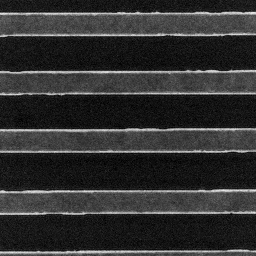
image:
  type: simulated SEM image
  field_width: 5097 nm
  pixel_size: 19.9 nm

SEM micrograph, lines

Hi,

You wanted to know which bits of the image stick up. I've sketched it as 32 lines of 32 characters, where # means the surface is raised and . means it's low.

................................
................................
################################
################################
#...............................
................................
................................
................................
................................
################################
################################
################################
................................
................................
................................
................................
################################
################################
################################
................................
................................
................................
................................
................................
################################
################################
################################
................................
................................
................................
................................
...........#####################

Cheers